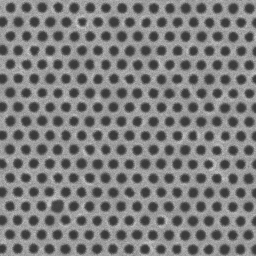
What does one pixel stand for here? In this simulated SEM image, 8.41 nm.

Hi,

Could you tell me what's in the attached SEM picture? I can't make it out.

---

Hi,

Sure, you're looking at a regular array of holes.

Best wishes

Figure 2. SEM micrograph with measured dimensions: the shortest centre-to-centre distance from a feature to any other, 15.8 pixels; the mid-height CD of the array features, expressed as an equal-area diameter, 90.5 nanometres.